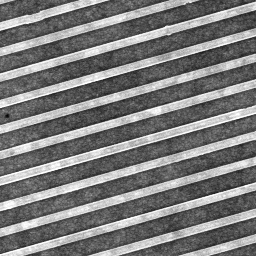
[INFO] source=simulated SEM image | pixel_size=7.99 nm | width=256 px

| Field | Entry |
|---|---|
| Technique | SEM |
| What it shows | parallel lines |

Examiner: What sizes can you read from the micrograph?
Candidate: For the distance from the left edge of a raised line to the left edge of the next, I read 199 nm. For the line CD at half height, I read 60.5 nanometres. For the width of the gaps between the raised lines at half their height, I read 136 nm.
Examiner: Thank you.